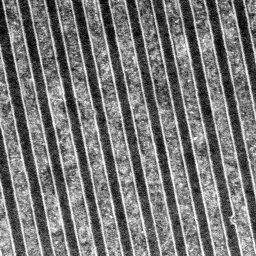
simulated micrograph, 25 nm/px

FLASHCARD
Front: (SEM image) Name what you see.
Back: parallel lines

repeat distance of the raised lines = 656 nanometres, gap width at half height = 0.282 micrometres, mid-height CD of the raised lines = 374 nm